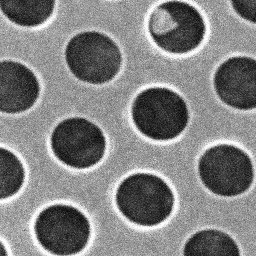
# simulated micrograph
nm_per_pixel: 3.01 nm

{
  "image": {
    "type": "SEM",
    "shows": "holes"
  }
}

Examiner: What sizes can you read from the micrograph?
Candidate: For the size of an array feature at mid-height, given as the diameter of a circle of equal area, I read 167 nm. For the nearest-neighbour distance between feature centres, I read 260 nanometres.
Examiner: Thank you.